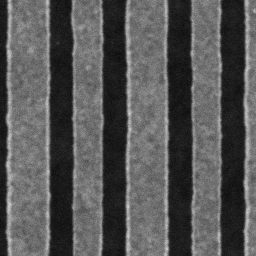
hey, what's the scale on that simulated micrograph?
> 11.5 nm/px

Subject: lines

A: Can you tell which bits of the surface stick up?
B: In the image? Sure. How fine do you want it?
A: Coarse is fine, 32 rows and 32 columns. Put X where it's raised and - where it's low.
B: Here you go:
-XXXXX---XXXX---XXXXX---XXXX---X
-XXXXX---XXXX---XXXXX---XXXX---X
-XXXXX---XXXX---XXXXX---XXXX---X
-XXXXX---XXXX---XXXXX---XXX----X
-XXXXX---XXXX---XXXXX---XXXX---X
-XXXXX---XXXX---XXXXX---XXX----X
-XXXXX---XXXX---XXXXX---XXXX---X
-XXXXX---XXXX---XXXXX---XXXX---X
-XXXXX---XXXX---XXXXX---XXXX---X
-XXXXX---XXXX---XXXXX---XXXX---X
-XXXXX---XXXX---XXXXX---XXXX---X
-XXXXX---XXXX---XXXXX---XXXX---X
-XXXXX---XXXX---XXXXX---XXXX---X
-XXXXX---XXXX---XXXXX---XXXX---X
-XXXXX---XXXX---XXXXX---XXXX---X
-XXXXX---XXXX---XXXXX---XXXX---X
-XXXXX---XXXX---XXXXX---XXXX---X
-XXXXX---XXXX---XXXXX---XXXX---X
-XXXXX---XXXX---XXXXX---XXXX---X
-XXXXX---XXXX---XXXXX---XXXX---X
-XXXXX---XXXX---XXXXX---XXXX---X
-XXXXX---XXXX---XXXXX---XXXX---X
-XXXXX---XXXX---XXXXX---XXXX---X
-XXXXX---XXXX---XXXXX---XXXX---X
-XXXXX---XXXX---XXXXX---XXXX---X
-XXXXX---XXXX---XXXXX---XXXX---X
-XXXXX---XXXX---XXXXX---XXXX---X
-XXXXX---XXXX---XXXXX---XXX----X
-XXXXX---XXXX---XXXXX---XXXX---X
-XXXXX---XXXX---XXXXX---XXX----X
-XXXXX---XXXX---XXXXX---XXXX---X
-XXXXX---XXXX---XXXXX---XXXX---X